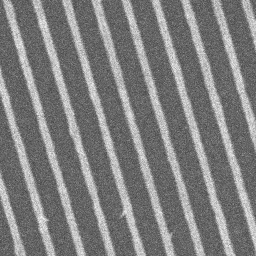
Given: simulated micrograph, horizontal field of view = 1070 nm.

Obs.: parallel lines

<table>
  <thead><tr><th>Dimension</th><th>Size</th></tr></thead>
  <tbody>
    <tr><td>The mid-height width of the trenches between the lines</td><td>96.1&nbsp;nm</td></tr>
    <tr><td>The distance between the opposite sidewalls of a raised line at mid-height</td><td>24.1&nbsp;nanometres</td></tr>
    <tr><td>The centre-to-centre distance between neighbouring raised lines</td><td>120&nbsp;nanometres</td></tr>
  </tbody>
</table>